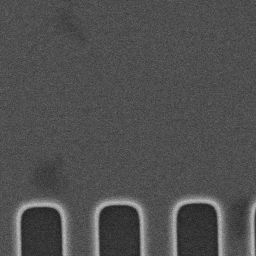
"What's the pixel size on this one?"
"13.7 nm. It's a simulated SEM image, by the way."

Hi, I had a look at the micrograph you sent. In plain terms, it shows groups of lines, slits or small figures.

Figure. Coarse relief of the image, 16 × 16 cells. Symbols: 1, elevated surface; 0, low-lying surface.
1111111111111111
1111111111111111
1111111111111111
1111111111111111
1111111111111111
1111111111111111
1111111111111111
1111111111111111
1111111111111111
1111111111111111
1111111111111111
1111111111111111
1111111111111111
1000110001100011
1000110001100011
1000110001100011